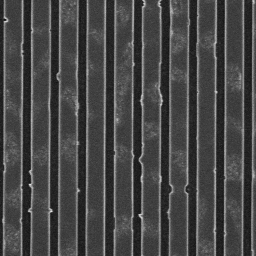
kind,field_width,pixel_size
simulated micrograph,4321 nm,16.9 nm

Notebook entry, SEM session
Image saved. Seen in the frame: parallel lines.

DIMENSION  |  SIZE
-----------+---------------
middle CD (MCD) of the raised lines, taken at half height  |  325 nm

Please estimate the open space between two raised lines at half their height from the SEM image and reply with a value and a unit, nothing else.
148 nanometers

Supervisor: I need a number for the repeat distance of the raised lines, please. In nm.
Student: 466